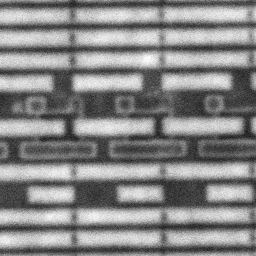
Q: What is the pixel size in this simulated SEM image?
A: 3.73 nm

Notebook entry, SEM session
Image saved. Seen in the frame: wiring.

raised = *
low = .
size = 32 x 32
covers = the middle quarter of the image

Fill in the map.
********************************
................................
................................
..******************.....*******
..******************.....*******
..******************.....*******
..*****************......****...
................................
.............****...............
.............****...............
.............****...............
.............****...............
................................
................................
...**************........*******
...**************........*******
...**************........*******
...**************........*******
................................
............******************..
********....******************..
********....******************..
********....******************..
................................
................................
********************************
********************************
********************************
************************.*******
................................
................................
**............***********.......